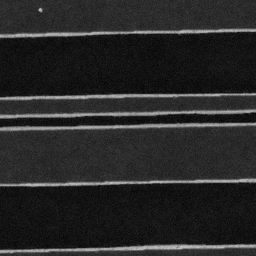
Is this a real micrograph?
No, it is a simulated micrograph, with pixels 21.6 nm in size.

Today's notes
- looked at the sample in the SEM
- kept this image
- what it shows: lines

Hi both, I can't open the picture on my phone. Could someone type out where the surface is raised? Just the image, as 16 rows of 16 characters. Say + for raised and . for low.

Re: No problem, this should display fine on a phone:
++++++++++++++++
++++++++++++++++
................
................
................
................
++++++++++++++++
++++++++++++++++
++++++++++++++++
++++++++++++++++
++++++++++++++++
+++.............
................
................
................
............++++